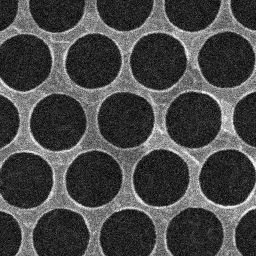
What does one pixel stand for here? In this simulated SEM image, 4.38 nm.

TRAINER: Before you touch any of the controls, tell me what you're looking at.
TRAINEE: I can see holes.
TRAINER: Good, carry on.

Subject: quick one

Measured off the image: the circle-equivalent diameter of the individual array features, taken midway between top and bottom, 57.9 px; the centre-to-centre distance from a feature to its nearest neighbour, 0.292 micrometres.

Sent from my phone